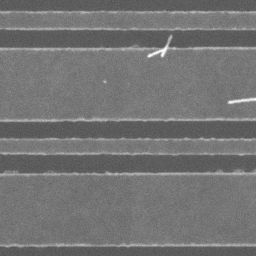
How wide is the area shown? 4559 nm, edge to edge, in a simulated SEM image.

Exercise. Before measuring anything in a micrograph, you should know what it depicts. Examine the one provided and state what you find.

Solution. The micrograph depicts lines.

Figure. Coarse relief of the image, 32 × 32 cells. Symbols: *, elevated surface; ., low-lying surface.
................................
********************************
********************************
********************************
................................
................................
********************************
********************************
********************************
********************************
********************************
********************************
********************************
********************************
********************************
................................
................................
********************************
********************************
................................
................................
................................
********************************
********************************
********************************
********************************
********************************
********************************
********************************
********************************
********************************
................................